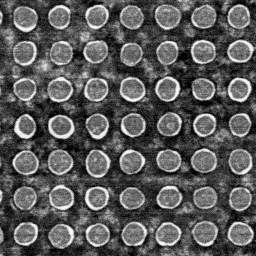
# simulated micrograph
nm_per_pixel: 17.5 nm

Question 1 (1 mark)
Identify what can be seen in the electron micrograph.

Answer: a regular array of raised bodies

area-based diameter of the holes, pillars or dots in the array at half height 400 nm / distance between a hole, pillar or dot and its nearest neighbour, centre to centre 612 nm